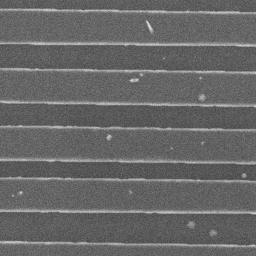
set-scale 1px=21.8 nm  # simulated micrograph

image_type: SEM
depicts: lines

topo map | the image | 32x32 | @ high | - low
--------------------------------
@@@@@@@@@@@@@@@@@@@@@-----------
@@@@@@@@@@@@@@@@@@@@@@@@@@@@@@@@
@@@@@@@@@@@@@@@@@@@@@@@@@@@@@@@@
@@@@@@@@@@@@@@@@@@@@@@@@@@@@@@@@
-----@@@@@@@@@@@@@@@@@@@@@@@@@@@
--------------------------------
--------------------------------
--------------------------------
@@@@@@@@@@@@@@@@@@@@@@@@@@@@@@@@
@@@@@@@@@@@@@@@@@@@@@@@@@@@@@@@@
@@@@@@@@@@@@@@@@@@@@@@@@@@@@@@@@
@@@@@@@@@@@@@@@@@@@@@@@@@@@@@@@@
--------------------------------
--------------------------------
--------------------------------
@@@@@@@@@@@@@@@@@@@@@@@@@@@@@@@@
@@@@@@@@@@@@@@@@@@@@@@@@@@@@@@@@
@@@@@@@@@@@@@@@@@@@@@@@@@@@@@@@@
@@@@@@@@@@@@@@@@@@@@@@@@@@@@@@@@
--------------------------------
--------------------------------
@@@@@@@@@@@@@@@@@@@@@@@@@-------
@@@@@@@@@@@@@@@@@@@@@@@@@@@@@@@@
@@@@@@@@@@@@@@@@@@@@@@@@@@@@@@@@
@@@@@@@@@@@@@@@@@@@@@@@@@@@@@@@@
-------@@@@@@@@@@@@@@@@@@@@@@@@@
--------------------------------
--------------------------------
--------------------------------
@@@@@@@@@@@@@@@@----------------
@@@@@@@@@@@@@@@@@@@@@@@@@@@@@@@@